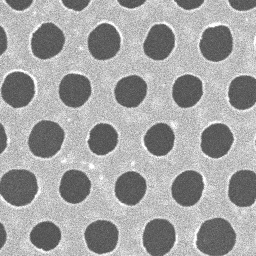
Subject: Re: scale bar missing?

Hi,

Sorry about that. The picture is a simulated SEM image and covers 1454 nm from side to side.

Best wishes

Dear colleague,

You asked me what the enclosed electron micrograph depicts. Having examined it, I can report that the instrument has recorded a regular array of holes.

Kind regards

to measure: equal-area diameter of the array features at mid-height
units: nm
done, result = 192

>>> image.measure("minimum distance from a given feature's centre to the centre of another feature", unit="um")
0.316